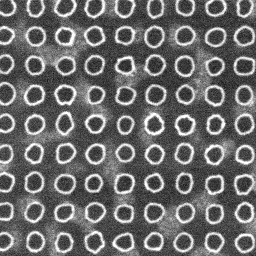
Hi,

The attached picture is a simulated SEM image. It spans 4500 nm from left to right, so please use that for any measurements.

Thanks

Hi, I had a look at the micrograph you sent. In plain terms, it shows a regular array of raised bodies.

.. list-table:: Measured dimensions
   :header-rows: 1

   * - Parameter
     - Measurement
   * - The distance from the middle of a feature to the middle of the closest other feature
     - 506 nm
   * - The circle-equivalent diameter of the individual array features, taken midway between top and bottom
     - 0.322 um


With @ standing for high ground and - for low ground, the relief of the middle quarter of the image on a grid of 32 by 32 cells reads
@@@--@@@@@---@@@@----@@@@---@@@@
@@----@@@----@@@@----@@@@---@@@@
@------@--------------@@-----@@@
--------------------------------
----------------@---------------
@--@------------------@-------@-
@@@-@-@@@@----@@@----@@@@----@@@
@@@-@-@@@@---@@@@@---@@@@---@@@@
@@@---@@@@---@@@@----@@@@---@@@@
@@----@@@-----@@@----@@@-----@@@
--------------------------------
--------------------------------
@-------------------------------
@@----@@@@----@@@----@@@-----@@-
@@----@@@@----@@@---@@@@@---@@@@
@@----@@@@----@@@---@@@@@---@@@@
@@----@@@-----@@@----@@@@----@@@
----------------------@------@@-
--------------------------------
--------------------------------
@@-----@@@----@@------@@-----@@-
@@@---@@@@---@@@@----@@@@---@@@@
@@@---@@@@---@@@@---@@@@@---@@@@
@@----@@@@----@@@----@@@@---@@@@
@------@@-------------@@-----@@-
--------------------------------
--------------------------------
-----------------------------@--
@@----@@@----@@@@----@@@-----@@@
@@@---@@@----@@@@---@@@@@---@@@@
@@@---@@@----@@@@----@@@@---@@@@
@@----@@@----@@@@-----@@-----@@-